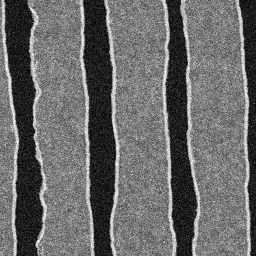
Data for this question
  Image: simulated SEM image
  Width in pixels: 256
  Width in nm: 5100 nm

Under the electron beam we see one or a few lines or trenches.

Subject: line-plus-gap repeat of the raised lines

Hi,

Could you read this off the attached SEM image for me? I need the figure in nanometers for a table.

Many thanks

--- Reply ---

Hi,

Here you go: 1550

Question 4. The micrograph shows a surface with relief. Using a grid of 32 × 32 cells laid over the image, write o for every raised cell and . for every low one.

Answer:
....oooooo...ooooooo...ooooooo..
....oooooo...oooooooo..ooooooo..
.....ooooo....ooooooo..ooooooo..
....oooooo....ooooooo..ooooooo..
....oooooo....ooooooo..ooooooo..
o...oooooo....ooooooo...oooooo..
o...oooooo....ooooooo...oooooo..
o...oooooo....ooooooo...oooooo..
o...oooooo....ooooooo...oooooo..
o...oooooo....ooooooo..oooooooo.
o....oooooo...oooooo....ooooooo.
o....oooooo...oooooo....ooooooo.
o....oooooo...ooooooo...ooooooo.
oo..ooooooo...ooooooo...ooooooo.
oo..ooooooo...ooooooo...ooooooo.
oo..ooooooo...ooooooo...ooooooo.
oo..ooooooo...ooooooo...ooooooo.
oo..ooooooo....oooooo...ooooooo.
oo...oooooo....oooooo...ooooooo.
oo...oooooo....oooooo...ooooooo.
oo...oooooo....oooooo...ooooooo.
oo...oooooo....oooooo...ooooooo.
oo....ooooo....oooooo...ooooooo.
oo....ooooo....oooooo....oooooo.
oo...oooooo....oooooo....oooooo.
oo...oooooo...ooooooo....oooooo.
oo....ooooo...ooooooo....oooooo.
oo....ooooo...ooooooo....oooooo.
oo...oooooo...ooooooo....oooooo.
oo...oooooo...oooooooo...oooooo.
oo...ooooooo..oooooooo..ooooooo.
oo...ooooooo..oooooooo..ooooooo.